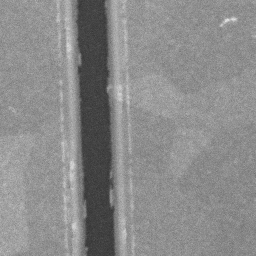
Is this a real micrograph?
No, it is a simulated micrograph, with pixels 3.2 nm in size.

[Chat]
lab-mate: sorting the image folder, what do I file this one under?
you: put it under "one or a few lines or trenches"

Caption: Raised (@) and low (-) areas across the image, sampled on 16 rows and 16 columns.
@@@@---@@@@@@@@@
@@@@---@@@@@@@@@
@@@@---@@@@@@@@@
@@@@---@@@@@@@@@
@@@@---@@@@@@@@@
@@@@@--@@@@@@@@@
@@@@@--@@@@@@@@@
@@@@@--@@@@@@@@@
@@@@@--@@@@@@@@@
@@@@@--@@@@@@@@@
@@@@@--@@@@@@@@@
@@@@@--@@@@@@@@@
@@@@@---@@@@@@@@
@@@@@---@@@@@@@@
@@@@@---@@@@@@@@
@@@@@---@@@@@@@@